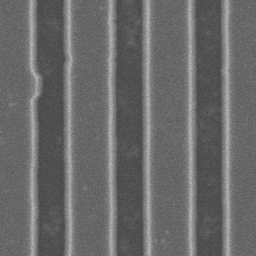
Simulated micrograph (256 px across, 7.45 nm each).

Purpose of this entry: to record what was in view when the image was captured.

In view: one or a few lines or trenches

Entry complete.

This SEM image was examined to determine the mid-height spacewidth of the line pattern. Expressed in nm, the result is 236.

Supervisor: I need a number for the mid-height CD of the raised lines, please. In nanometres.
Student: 354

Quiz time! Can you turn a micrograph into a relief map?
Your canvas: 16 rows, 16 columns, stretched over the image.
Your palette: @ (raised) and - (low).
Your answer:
@@--@@@--@@@--@@
@@--@@@--@@@--@@
@@--@@@--@@@--@@
@@--@@@--@@@--@@
@@--@@@--@@@--@@
@@--@@@--@@@--@@
@@--@@@--@@@--@@
@@--@@@--@@@--@@
@@--@@@--@@@--@@
@@--@@@--@@@--@@
@@--@@@--@@@--@@
@@--@@@--@@@--@@
@@--@@@--@@@--@@
@@--@@@--@@@--@@
@@--@@@--@@@--@@
@@--@@@--@@@--@@